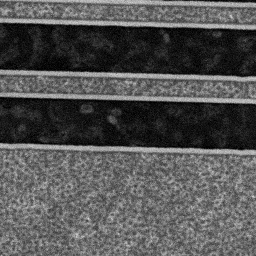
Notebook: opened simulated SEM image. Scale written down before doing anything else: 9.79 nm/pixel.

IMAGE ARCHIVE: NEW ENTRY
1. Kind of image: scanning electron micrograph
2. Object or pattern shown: one or a few lines or trenches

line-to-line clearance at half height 498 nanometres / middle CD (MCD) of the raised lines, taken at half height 0.224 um